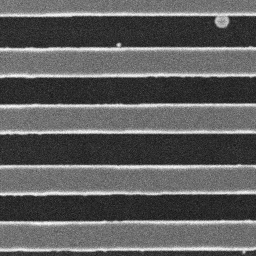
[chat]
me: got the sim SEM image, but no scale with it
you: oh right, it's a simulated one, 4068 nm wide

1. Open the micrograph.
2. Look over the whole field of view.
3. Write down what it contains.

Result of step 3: lines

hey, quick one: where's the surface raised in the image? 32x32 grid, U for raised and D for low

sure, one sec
UUUUUUUUUUUUUUUUUUUUUUUUUUUUUUUU
UUUUUUUUUUUUUUUUUUUUUUUUUUUUUUUU
DDDDDDDDDDDDDDDDDDDDDDDDDDDDDDDD
DDDDDDDDDDDDDDDDDDDDDDDDDDDDDDDD
DDDDDDDDDDDDDDDDDDDDDDDDDDDDDDDD
DDDDDDDDDDDDDDDDDDDDDDDDDDDDDDDD
UUUUUUUUUUUUUUUUUUUUUUUUUUUUUUUU
UUUUUUUUUUUUUUUUUUUUUUUUUUUUUUUU
UUUUUUUUUUUUUUUUUUUUUUUUUUUUUUUU
UUUUUUUUUUUUUUUUUUDDDDDDDDDDDDDD
DDDDDDDDDDDDDDDDDDDDDDDDDDDDDDDD
DDDDDDDDDDDDDDDDDDDDDDDDDDDDDDDD
DDDDDDDDDDDDDDDDDDDDDDDDDDDDDDDD
UUUUUUUUUUUUUUUUUUUUUUUUUUUUUUUU
UUUUUUUUUUUUUUUUUUUUUUUUUUUUUUUU
UUUUUUUUUUUUUUUUUUUUUUUUUUUUUUUU
UUUUUUUUUUUUUUUUUUUUUUUUUUUUUUUU
DDDDDDDDDDDDDDDDDDDDDDDDDDDDDDDD
DDDDDDDDDDDDDDDDDDDDDDDDDDDDDDDD
DDDDDDDDDDDDDDDDDDDDDDDDDDDDDDDD
DDDDDDDDDDDDDDDDDDDDDDDDDDDDDDDD
UUUUUUUUUUUUUUUUUUUUUUUUUUUUUUUU
UUUUUUUUUUUUUUUUUUUUUUUUUUUUUUUU
UUUUUUUUUUUUUUUUUUUUUUUUUUUUUUUU
DDDDDDDDDDDDDDDDDDDDDDDDDDDDDDDD
DDDDDDDDDDDDDDDDDDDDDDDDDDDDDDDD
DDDDDDDDDDDDDDDDDDDDDDDDDDDDDDDD
DDDDDDDDDDDDDDDDDDDDDDDDDDDDDDDD
UUUUUUUUUUUUUUUUUUUUUUUUUUUUUUUU
UUUUUUUUUUUUUUUUUUUUUUUUUUUUUUUU
UUUUUUUUUUUUUUUUUUUUUUUUUUUUUUUU
DDDDDDDDDDDDDDDDDDDDDDDDDDDDDDDD